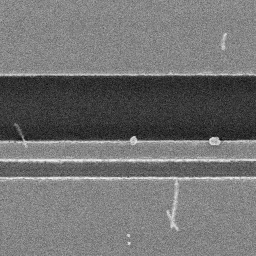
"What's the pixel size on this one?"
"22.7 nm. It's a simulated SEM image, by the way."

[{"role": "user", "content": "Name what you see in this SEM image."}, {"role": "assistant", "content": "lines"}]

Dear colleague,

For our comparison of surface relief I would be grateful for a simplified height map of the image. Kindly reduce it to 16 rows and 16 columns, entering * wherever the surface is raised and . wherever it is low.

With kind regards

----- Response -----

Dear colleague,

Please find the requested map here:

****************
****************
****************
****************
****************
................
................
................
................
****************
****************
****************
****************
****************
****************
****************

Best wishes